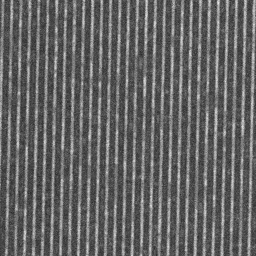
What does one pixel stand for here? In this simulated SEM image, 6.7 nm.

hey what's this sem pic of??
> parallel lines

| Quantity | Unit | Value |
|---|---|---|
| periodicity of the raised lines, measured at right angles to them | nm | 60.1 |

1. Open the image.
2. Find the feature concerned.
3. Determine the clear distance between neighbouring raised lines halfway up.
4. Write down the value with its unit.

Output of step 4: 0.046 µm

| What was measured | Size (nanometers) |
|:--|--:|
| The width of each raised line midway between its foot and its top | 12.6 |